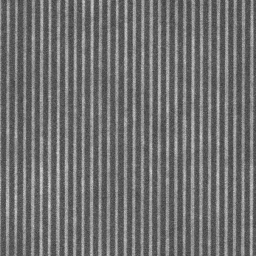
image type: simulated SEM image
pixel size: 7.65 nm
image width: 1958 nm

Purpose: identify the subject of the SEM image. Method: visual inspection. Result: parallel lines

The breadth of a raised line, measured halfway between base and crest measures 14.3 nm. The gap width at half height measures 48.8 nm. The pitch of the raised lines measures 0.0643 um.